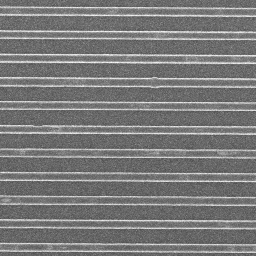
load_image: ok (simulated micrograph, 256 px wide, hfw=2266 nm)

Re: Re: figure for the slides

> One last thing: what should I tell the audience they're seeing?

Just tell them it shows parallel lines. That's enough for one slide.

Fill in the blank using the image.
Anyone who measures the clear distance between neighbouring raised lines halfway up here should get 137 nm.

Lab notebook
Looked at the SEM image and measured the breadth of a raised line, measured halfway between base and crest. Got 69.7 nm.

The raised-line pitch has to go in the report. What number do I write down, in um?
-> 0.209